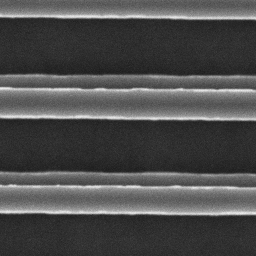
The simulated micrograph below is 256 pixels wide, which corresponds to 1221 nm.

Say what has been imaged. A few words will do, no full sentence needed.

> lines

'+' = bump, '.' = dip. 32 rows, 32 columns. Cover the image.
++++++++++++++++++++++++++++++++
++++++++++++++++++++++++++++++++
................................
................................
................................
................................
................................
................................
................................
................................
++++++++++++++++++++++++++++++++
++++++++++++++++++++++++++++++++
++++++++++++++++++++++++++++++++
++++++++++++++++++++++++++++++++
++++++++++++++++++++++++++++++++
................................
................................
................................
................................
................................
................................
................................
++++++++++++++++++++++++++++++++
++++++++++++++++++++++++++++++++
++++++++++++++++++++++++++++++++
++++++++++++++++++++++++++++++++
++++++++++++++++++++++++++++++++
................................
................................
................................
................................
................................